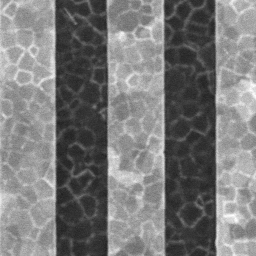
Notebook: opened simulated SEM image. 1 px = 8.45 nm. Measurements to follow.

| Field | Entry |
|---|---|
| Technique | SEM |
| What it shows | one or a few lines or trenches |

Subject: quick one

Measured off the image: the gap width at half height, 450 nm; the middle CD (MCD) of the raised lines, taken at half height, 466 nm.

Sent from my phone